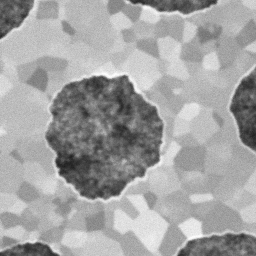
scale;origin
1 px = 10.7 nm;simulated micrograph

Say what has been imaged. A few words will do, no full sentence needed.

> holes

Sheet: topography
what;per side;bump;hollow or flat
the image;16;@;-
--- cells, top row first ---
--@@@@@@@----@@@
-@@@@@@@@@@@@@@@
@@@@@@@@@@@@@@@@
@@@@@@@@@@@@@@@@
@@@@@@@@@@@@@@@@
@@@@-----@@@@@@-
@@@------@@@@@--
@@@-------@@@@@-
@@@-------@@@@@-
@@@-------@@@@@@
@@@-------@@@@@@
@@@@----@@@@@@@@
@@@@@@@@@@@@@@@@
@@@@@@@@@@@@@@@@
@@@@@@@@@@@@@@@@
@--@@@@@@@@-----